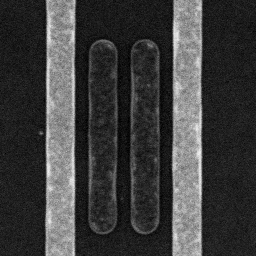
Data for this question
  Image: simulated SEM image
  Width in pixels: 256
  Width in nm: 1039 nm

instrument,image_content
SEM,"groups of lines, slits or small figures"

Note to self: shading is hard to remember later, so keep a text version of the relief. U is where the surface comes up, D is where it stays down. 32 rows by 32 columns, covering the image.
DDDDDDUUUDDDDDDDDDDDDDUUUDDDDDDD
DDDDDDUUUDDDDDDDDDDDDDUUUDDDDDDD
DDDDDDUUUDDDDDDDDDDDDDUUUDDDDDDD
DDDDDDUUUDDDDDDDDDDDDDUUUDDDDDDD
DDDDDDUUUDDDDDDDDDDDDDUUUDDDDDDD
DDDDDDUUUDDDUUDDDUUDDDUUUDDDDDDD
DDDDDDUUUDDUUUUDDUUUDDUUUDDDDDDD
DDDDDDUUUDDUUUUDDUUUDDUUUDDDDDDD
DDDDDDUUUDDUUUUDDUUUDDUUUDDDDDDD
DDDDDDUUUDDUUUUDDUUUDDUUUDDDDDDD
DDDDDDUUUDDUUUUDDUUUDDUUUDDDDDDD
DDDDDDUUUDDUUUUDDUUUDDUUUDDDDDDD
DDDDDDUUUDDUUUUDDUUUDDUUUDDDDDDD
DDDDDDUUUDDUUUUDDUUUDDUUUDDDDDDD
DDDDDDUUUDDUUUUDDUUUDDUUUDDDDDDD
DDDDDDUUUDDUUUUDDUUUDDUUUDDDDDDD
DDDDDDUUUDDUUUUDUUUUDDUUUDDDDDDD
DDDDDDUUUDDUUUUDUUUUDDUUUDDDDDDD
DDDDDDUUUDDUUUUDUUUUDDUUUDDDDDDD
DDDDDDUUUDDUUUUDUUUUDDUUUDDDDDDD
DDDDDDUUUDDUUUUDUUUUDDUUUDDDDDDD
DDDDDDUUUDDUUUDDDUUUDDUUUDDDDDDD
DDDDDDUUUDDUUUDDDUUUDDUUUDDDDDDD
DDDDDDUUUDDUUUDDDUUUDDUUUDDDDDDD
DDDDDDUUUDDUUUDDDUUUDDUUUDDDDDDD
DDDDDDUUUDDUUUUDDUUUDDUUUDDDDDDD
DDDDDDUUUDDUUUUDDUUUDDUUUDDDDDDD
DDDDDDUUUDDUUUUDDUUUDDUUUDDDDDDD
DDDDDDUUUDDUUUDDDUUDDDUUUDDDDDDD
DDDDDDUUUDDDDDDDDDDDDDUUUDDDDDDD
DDDDDDUUUDDDDDDDDDDDDDUUUDDDDDDD
DDDDDDUUUDDDDDDDDDDDDDUUUDDDDDDD